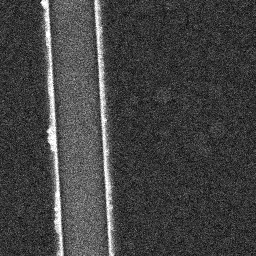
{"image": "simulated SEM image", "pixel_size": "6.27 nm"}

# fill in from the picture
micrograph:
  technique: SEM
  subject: one or a few lines or trenches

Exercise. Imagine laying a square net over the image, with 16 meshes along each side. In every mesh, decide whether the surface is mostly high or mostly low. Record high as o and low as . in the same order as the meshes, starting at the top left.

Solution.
ooo...oooooooooo
ooo...oooooooooo
ooo...oooooooooo
ooo...oooooooooo
ooo...oooooooooo
ooo...oooooooooo
ooo...oooooooooo
ooo...oooooooooo
ooo...oooooooooo
oooo...ooooooooo
oooo...ooooooooo
oooo...ooooooooo
oooo...ooooooooo
oooo...ooooooooo
oooo...ooooooooo
oooo...ooooooooo